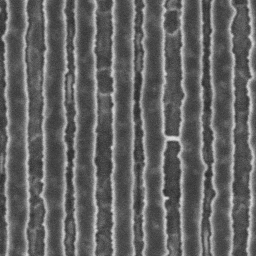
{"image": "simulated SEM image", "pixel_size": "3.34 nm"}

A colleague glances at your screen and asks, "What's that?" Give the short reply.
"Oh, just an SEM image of parallel lines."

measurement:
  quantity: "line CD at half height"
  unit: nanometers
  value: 69.6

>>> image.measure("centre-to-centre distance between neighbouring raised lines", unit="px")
34.2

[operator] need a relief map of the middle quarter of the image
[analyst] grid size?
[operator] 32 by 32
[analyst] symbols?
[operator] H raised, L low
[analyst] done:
HLLHHHHHLLLLHHHHHHLLHHHHHLLLLLHH
HLLHHHHHLLLLHHHHHHLLHHHHHLLLLLHH
LLLHHHHHLLLLHHHHHHLLHHHHHHLLLLHH
LLLHHHHHLLLLHHHHHHLLHHHHHLLLLLHH
LHLHHHHHLLLLHHHHHHLLHHHHHLLLLHHH
LLHHHHHHLLLLHHHHHLLHHHHHHLLLLHHH
LHLHHHHHLLLLLHHHHLLHHHHHHLLLLLHH
LLLHHHHHLLLLHHHHHLLHHHHHHLLLLLHH
LLLHHHHHLLLLHHHHHLLHHHHHHLLLLLHH
LLLHHHHHLLLLHHHHHHLHHHHHHLLLLLHH
LLLHHHHHLLLLHHHHHLLHHHHHHLLLLHHH
LLLHHHHHLLLLHHHHHLLHHHHHHLLLLHHH
LLLHHHHHLLLLHHHHHLLHHHHHHLLLLHHH
HLLHHHHHLLLLHHHHHLLHHHHHHLLLLHHH
HLLHHHHHLLLLHHHHHHLLHHHHHLLLLHHH
LLLHHHHHLLLLHHHHHHLLHHHHHLLLLHHH
LLLHHHHHLLLLHHHHHHLLHHHHHLLLLHHH
LLLHHHHHLLLLHHHHHHLLHHHHHLLLLHHH
LLLHHHHHLLLLHHHHHHLLHHHHHHHHHHHH
LLLHHHHHLLLLHHHHHHLLHHHHHHLLLHHH
HLLHHHHHLLLLHHHHHLLLHHHHHHLLLHHH
HLLHHHHHLLLLHHHHHHLLHHHHHLLLLHHH
HLLHHHHHLLLLHHHHHLLLHHHHHLLLLHHH
HLLHHHHHLLLLHHHHHHLLHHHHHLLLLHHH
HLHHHHHHLLLLHHHHHHLLHHHHHLLLLHHH
HLLHHHHHLLLLHHHHHLLLHHHHHLLLLHHH
LLHHHHHHLLLLHHHHHLLLHHHHHLLLLHHH
LLHHHHHHLLLLHHHHHHLLHHHHHLLLLHHH
LLHHHHHHLLLLHHHHHHLLHHHHHLLLLHHH
LLHHHHHHLLLLHHHHHHLLHHHHHLLLLHHH
LLHHHHHHLLLLHHHHHHLLHHHHHLLLLHHH
LLLHHHHHLLLLHHHHHLLLHHHHHLLLLHHH